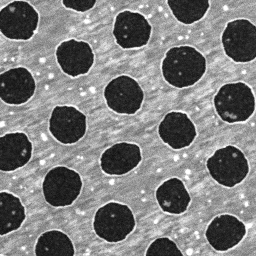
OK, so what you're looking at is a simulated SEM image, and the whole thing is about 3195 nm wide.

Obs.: a regular array of holes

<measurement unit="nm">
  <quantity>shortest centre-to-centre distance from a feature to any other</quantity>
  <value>782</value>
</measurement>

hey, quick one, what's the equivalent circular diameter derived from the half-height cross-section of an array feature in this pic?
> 481 nm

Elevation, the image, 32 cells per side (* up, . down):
*...****....*********.....******
.....**********..****.....******
.....*********....****...****..*
.....*********.....*********....
*...**********.....*********....
********...****...**********....
*******.....*********....***....
*******.....********......***...
**.*****...*********......******
....*****.*****.****.....*******
....*********....****...****...*
....*********.....*********.....
....*********.....*********.....
*******..*****...**********.....
******.....**********..****....*
******.....*********....********
******.....*********.....*******
....***...**********....********
....**********...*****.*****..**
....*********.....********.....*
...**********....*********.....*
******....***...**********.....*
*****.....***********..****...**
*****.....**********...*********
..****....**********....********
...***...****..*****....********
...*********.....****..*********
...*********.....**********...**
..**********.....*********.....*
*****...****....**********.....*
****.....**********...****....**
****.....*********.....*********